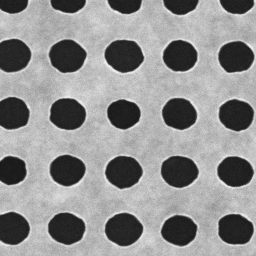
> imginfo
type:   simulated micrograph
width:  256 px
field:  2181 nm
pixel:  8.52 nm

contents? a regular array of holes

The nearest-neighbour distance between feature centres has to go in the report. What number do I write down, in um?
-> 0.475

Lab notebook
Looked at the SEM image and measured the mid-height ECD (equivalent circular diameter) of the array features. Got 288 nanometres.